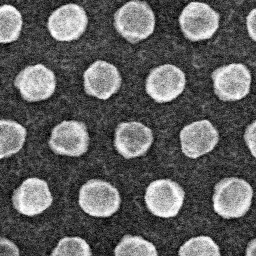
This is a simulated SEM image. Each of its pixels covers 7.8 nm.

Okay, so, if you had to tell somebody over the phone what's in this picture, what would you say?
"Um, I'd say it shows a regular array of raised bodies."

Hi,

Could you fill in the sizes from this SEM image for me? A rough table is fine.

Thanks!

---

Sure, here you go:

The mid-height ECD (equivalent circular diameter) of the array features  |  0.287 um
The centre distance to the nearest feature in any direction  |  503 nm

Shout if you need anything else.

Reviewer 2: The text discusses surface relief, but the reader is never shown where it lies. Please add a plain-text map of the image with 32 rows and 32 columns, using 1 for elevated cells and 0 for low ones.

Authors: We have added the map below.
00000000000000001100000011000000
11000001110000011110000111100001
11100011111000011110001111100001
11100011110000011110000111100001
11000001100000001110000111000001
00000000000000000000000000000000
00000000000000000000000000000000
00000000000000000000000000000000
00001100000111000000110000001110
00011110000111100001111000011110
00111110000111100011111000011110
00011110000111000011111000011110
00000000000000000000100000000000
00000000000000000000000000000000
00000000000000000000000000000000
11000000110000011100000011000000
11100001111000011110000111100001
11100011111000011110001111100001
11100001111000011100000111100001
10000000000000001000000110000000
00000000000000000000000000000000
00000000000000000000000000000000
00011000000000000000000000000000
00011100001111000001110000011110
00111100001111100011111000011111
00111100001111100011111000011110
00011000000111000001110000011100
00000000000000000000000000000000
00000000000000000000000000000000
00000000000000000000000000000000
10000001111000011110000111100000
11000001111000111111001111100001